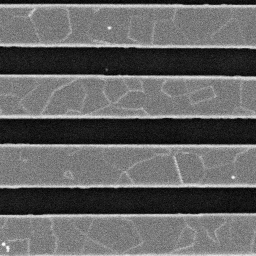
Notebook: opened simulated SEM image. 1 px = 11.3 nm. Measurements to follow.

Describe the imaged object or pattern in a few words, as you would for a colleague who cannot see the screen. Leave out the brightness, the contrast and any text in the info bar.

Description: lines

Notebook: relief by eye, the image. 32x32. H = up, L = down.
LLLLLLLLLLLLLLLLLLLLLLLLLLLLLLLL
HHHHHHHHHHHHHHHHHHHHHHHHHHHHHHHH
HHHHHHHHHHHHHHHHHHHHHHHHHHHHHHHH
HHHHHHHHHHHHHHHHHHHHHHHHHHHHHHHH
HHHHHHHHHHHHHHHHHHHHHHHHHHHHHHHH
HHHHHHHHHHHHHHHHHHHHHHHHHHHHHHHH
LLLLLLLLLLLLLLLLLLLLLLLLLLLLLLLL
LLLLLLLLLLLLLLLLLLLLLLLLLLLLLLLL
LLLLLLLLLLLLLLLLLLLLLLLLLLLLLLLL
HHHHHHHHHHHHHLLLLLLLLLLLLLLLLLLL
HHHHHHHHHHHHHHHHHHHHHHHHHHHHHHHH
HHHHHHHHHHHHHHHHHHHHHHHHHHHHHHHH
HHHHHHHHHHHHHHHHHHHHHHHHHHHHHHHH
HHHHHHHHHHHHHHHHHHHHHHHHHHHHHHHH
HHHHHHHHHHHHHHHHHHHHHHHHHHHHHHHH
LLLLLLLLLLLLLLLLLLLLLLLLLLLLLLLL
LLLLLLLLLLLLLLLLLLLLLLLLLLLLLLLL
LLLLLLLLLLLLLLLLLLLLLLLLLLLLLLLL
HHHHHHHHHHHHHHHHHHHHHHHHHHHHHHHH
HHHHHHHHHHHHHHHHHHHHHHHHHHHHHHHH
HHHHHHHHHHHHHHHHHHHHHHHHHHHHHHHH
HHHHHHHHHHHHHHHHHHHHHHHHHHHHHHHH
HHHHHHHHHHHHHHHHHHHHHHHHHHHHHHHH
LLLLLLLLLLLLLLLLLLLLLLLLLLLLLLLL
LLLLLLLLLLLLLLLLLLLLLLLLLLLLLLLL
LLLLLLLLLLLLLLLLLLLLLLLLLLLLLLLL
LLLLLLLLLLLLLLLLLLLLLLLLLLLLLLLL
HHHHHHHHHHHHHHHHHHHHHHHHHHHHHHHH
HHHHHHHHHHHHHHHHHHHHHHHHHHHHHHHH
HHHHHHHHHHHHHHHHHHHHHHHHHHHHHHHH
HHHHHHHHHHHHHHHHHHHHHHHHHHHHHHHH
HHHHHHHHHHHHHHHHHHHHHHHHHHHHHHHH